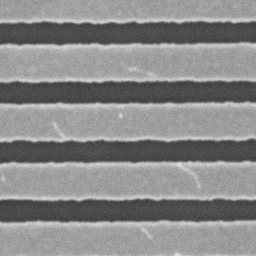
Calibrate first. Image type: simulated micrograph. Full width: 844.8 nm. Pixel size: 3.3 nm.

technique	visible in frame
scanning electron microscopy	lines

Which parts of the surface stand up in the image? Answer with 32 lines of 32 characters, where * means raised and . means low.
********************************
********************************
********************************
................................
................................
................................
********************************
********************************
********************************
********************************
................................
................................
................................
********************************
********************************
********************************
********************************
**.*********.****...**.......*..
................................
................................
.*....*.***.********************
********************************
********************************
********************************
********************************
................................
................................
................................
********************************
********************************
********************************
********************************